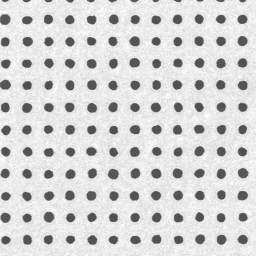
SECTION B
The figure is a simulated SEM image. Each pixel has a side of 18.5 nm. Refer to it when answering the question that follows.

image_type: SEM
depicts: a regular array of holes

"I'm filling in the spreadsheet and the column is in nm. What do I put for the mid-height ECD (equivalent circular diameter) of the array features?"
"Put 179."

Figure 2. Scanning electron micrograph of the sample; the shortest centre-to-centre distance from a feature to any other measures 395 nm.